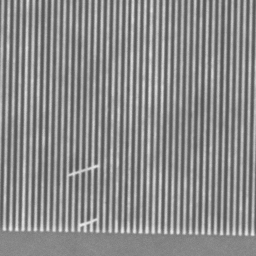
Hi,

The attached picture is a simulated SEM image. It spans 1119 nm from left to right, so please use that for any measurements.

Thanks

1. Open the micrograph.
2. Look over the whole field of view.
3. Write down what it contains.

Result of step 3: parallel lines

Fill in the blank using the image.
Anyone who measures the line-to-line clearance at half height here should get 4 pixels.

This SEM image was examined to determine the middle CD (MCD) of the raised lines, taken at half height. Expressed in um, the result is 0.0087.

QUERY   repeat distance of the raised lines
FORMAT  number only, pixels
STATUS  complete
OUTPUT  6.2